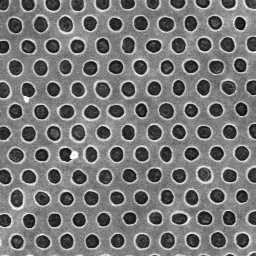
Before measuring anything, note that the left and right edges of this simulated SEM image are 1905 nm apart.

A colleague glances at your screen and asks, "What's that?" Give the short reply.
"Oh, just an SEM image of a regular array of holes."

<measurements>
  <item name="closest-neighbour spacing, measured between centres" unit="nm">181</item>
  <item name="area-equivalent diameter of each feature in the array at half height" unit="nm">106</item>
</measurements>